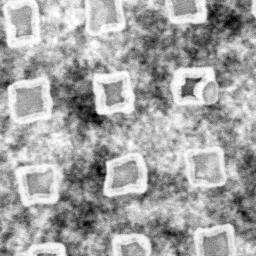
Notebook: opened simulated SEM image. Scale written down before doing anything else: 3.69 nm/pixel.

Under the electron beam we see raised bodies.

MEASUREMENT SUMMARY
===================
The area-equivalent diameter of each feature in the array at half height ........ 150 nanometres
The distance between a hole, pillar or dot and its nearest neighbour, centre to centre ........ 295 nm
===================